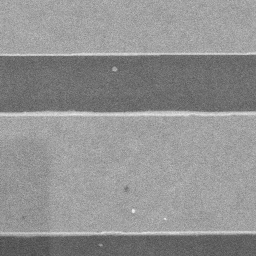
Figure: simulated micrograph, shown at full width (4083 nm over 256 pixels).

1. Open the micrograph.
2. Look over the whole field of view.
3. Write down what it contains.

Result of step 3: lines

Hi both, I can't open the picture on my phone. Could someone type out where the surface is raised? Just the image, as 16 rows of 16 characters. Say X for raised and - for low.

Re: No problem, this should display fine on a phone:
XXXXXXXXXXXXXXXX
XXXXXXXXXXXXXXXX
XXXXXXXXXXXXXXXX
----------------
----------------
----------------
----------------
XXXXXXXXXXXXXXXX
XXXXXXXXXXXXXXXX
XXXXXXXXXXXXXXXX
XXXXXXXXXXXXXXXX
XXXXXXXXXXXXXXXX
XXXXXXXXXXXXXXXX
XXXXXXXXXXXXXXXX
XXXXXXXXXXXXXXXX
----------------